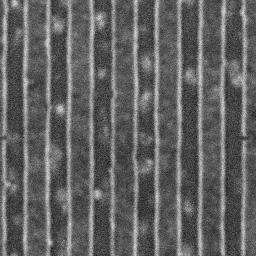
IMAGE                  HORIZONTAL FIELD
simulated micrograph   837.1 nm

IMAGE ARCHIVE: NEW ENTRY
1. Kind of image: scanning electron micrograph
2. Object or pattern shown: parallel lines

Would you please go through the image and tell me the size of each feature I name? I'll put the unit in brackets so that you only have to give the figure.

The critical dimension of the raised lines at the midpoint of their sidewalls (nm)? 76.9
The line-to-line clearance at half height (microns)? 0.0655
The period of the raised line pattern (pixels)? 43.7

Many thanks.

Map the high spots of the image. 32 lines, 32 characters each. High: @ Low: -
@--@@@---@@---@@@---@@---@@@--@@
@--@@@---@@@--@@@---@@---@@@--@@
@--@@@---@@@--@@@---@@---@@@--@@
@--@@@---@@@--@@@---@@---@@@--@@
@--@@@---@@---@@@---@@@--@@@---@
@--@@@---@@---@@@---@@---@@@---@
@--@@@---@@---@@@---@@@--@@@---@
@--@@@---@@---@@@---@@@--@@@---@
@--@@@---@@---@@@---@@@--@@@---@
@--@@@---@@---@@@---@@@--@@@--@@
@--@@@---@@@--@@@---@@---@@@--@@
@--@@@---@@---@@@---@@---@@@--@@
@--@@@---@@---@@@---@@---@@@--@@
@--@@@---@@---@@@---@@---@@@---@
@--@@@---@@---@@@--@@@@--@@@--@@
@--@@@---@@---@@@--@@@@--@@@--@@
@--@@@---@@---@@@---@@@--@@@--@@
---@@@---@@---@@@---@@@--@@@---@
---@@@---@@---@@@---@@---@@@--@@
---@@@---@@---@@@---@@---@@@--@@
@--@@@---@@---@@@---@@---@@@--@@
@--@@@---@@@--@@@---@@---@@@--@@
@--@@@---@@@--@@@---@@---@@@--@@
@--@@@---@@@--@@@---@@---@@@---@
@--@@@---@@@--@@@---@@---@@@--@@
---@@@---@@@--@@@---@@---@@@--@@
---@@@---@@---@@@---@@---@@@--@@
@--@@@---@@---@@@---@@---@@@--@@
@--@@@---@@---@@@---@@---@@@--@@
@--@@@---@@---@@@---@@---@@@--@@
@--@@@---@@---@@@---@@---@@@--@@
@--@@@---@@---@@@---@@---@@@--@@